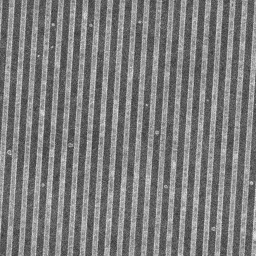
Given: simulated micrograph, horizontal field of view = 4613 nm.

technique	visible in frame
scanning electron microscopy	parallel lines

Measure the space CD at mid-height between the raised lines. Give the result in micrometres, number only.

0.144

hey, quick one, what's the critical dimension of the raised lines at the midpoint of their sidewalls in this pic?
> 76.4 nanometres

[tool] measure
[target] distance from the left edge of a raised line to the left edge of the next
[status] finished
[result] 12.2 px